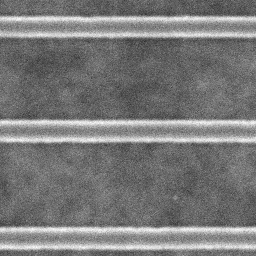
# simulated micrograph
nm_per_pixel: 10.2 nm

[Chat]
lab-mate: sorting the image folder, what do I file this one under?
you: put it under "lines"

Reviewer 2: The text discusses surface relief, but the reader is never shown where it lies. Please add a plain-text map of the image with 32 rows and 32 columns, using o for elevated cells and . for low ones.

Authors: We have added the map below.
................................
................................
oooooooooooooooooooooooooooooooo
oooooooooooooooooooooooooooooooo
oooooooooooooooooooooo.oo.oooooo
................................
................................
................................
................................
................................
................................
................................
................................
................................
................................
oooooooooooooooooooooooooooooooo
oooooooooooooooooooooooooooooooo
oooooooooooooooooooooooooooooooo
................................
................................
................................
................................
................................
................................
................................
................................
................................
................................
.......................o........
oooooooooooooooooooooooooooooooo
oooooooooooooooooooooooooooooooo
................................